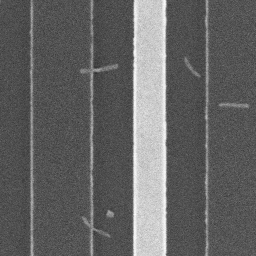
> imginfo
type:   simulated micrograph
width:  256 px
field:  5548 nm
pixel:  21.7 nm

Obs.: lines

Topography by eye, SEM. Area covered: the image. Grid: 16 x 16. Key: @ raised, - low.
--@@@@--@@---@@@
--@@@@--@@---@@@
--@@@@--@@---@@@
--@@@@--@@---@@@
--@@@@--@@---@@@
--@@@@--@@---@@@
--@@@@--@@---@@@
--@@@@--@@---@@@
--@@@@--@@---@@@
--@@@@--@@---@@@
--@@@@--@@---@@@
--@@@@--@@---@@@
--@@@@--@@---@@@
--@@@@--@@---@@@
--@@@@--@@---@@@
--@@@@--@@---@@@